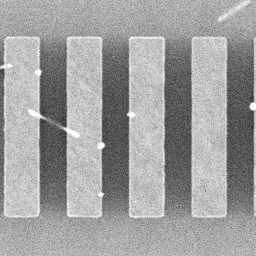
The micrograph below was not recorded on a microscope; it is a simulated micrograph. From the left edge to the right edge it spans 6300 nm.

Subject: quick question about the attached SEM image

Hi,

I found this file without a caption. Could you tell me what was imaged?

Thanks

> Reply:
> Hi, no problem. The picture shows groups of lines, slits or small figures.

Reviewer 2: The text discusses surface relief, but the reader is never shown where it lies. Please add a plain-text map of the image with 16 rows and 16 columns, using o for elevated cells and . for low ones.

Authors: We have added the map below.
................
................
.o..oo..oo..oo..
oo..oo..oo..oo..
oo..oo..oo..oo..
oo..oo..oo..oo..
oo..oo..oo..oo..
oo..oo..oo..oo..
oo..oo..oo..oo..
oo..oo..oo..oo..
oo..oo..oo..oo..
oo..oo..oo..oo..
oo..oo..oo..oo..
.o...o..oo..oo..
................
................